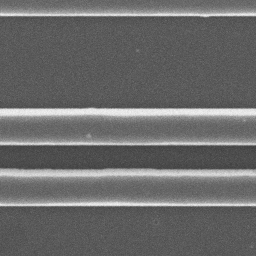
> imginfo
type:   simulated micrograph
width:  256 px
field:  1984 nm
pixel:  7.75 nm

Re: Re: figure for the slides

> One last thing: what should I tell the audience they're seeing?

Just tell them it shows lines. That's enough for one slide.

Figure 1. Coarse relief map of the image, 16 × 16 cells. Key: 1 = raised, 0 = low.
1111111111111111
0000000000000000
0000000000000000
0000000000000000
0000000000000000
0000000000000000
0000000000000000
1111111111111111
1111111111111111
0000000000000000
0000000000000000
1111111111111111
1111111111111111
0000000000000000
0000000000000000
0000000000000000